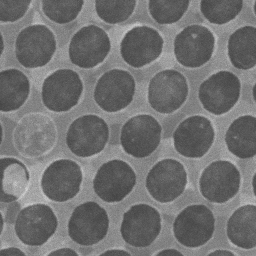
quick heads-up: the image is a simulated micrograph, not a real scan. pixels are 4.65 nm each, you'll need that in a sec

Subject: a regular array of holes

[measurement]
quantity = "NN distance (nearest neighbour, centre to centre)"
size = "238 nanometers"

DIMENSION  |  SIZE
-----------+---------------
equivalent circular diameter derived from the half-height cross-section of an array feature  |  200 nm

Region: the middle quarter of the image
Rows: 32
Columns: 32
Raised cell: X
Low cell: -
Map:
XXX-----XXXXXXXXX---XXXXXXXXX---
--XXXXXXXXXX---XXXXXXXXXX---XXXX
----XXXXXX------XXXXXXX-------XX
----XXXXX--------XXXXX--------XX
----XXXX----------XXX----------X
-----XXX----------XXX----------X
-----XX-----------XXX----------X
-----XX-----------XXX----------X
----XXX----------XXXX----------X
----XXXX---------XXXX---------XX
---XXXXXX-------XXXXXX--------XX
-XXXXXXXXX----XXXXXXXXX-----XXXX
XXXXXX--XXXXXXXXXX--XXXXX-XXXXXX
XXX------XXXXXXXX------XXXXXXXX-
XX--------XXXXX---------XXXXX---
X----------XXXX---------XXXX----
X----------XXX-----------XXX----
-----------XXX----------XXX-----
-----------XXX----------XXX-----
X----------XXX----------XXX-----
X----------XXX---------XXXX-----
X---------XXXXX--------XXXXX----
XXX-----XXXXXXXX------XXXXXXX---
XXXXXXXXXXXXXXXXXXX-XXXXXXXXXXX-
---XXXXXXXX----XXXXXXXX------XXX
----XXXXX-------XXXXXX--------XX
-----XXXX--------XXXXX---------X
-----XXX----------XXX----------X
-----XX-----------XXX----------X
-----XX-----------XX-----------X
-----XX-----------XX-----------X
----XXX----------XXXX---------XX